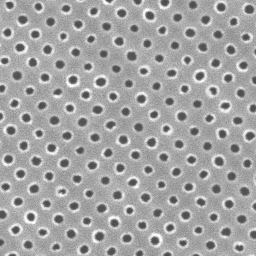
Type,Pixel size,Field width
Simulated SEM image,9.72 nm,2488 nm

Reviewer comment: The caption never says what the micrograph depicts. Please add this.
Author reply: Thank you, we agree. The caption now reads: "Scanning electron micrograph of a regular array of holes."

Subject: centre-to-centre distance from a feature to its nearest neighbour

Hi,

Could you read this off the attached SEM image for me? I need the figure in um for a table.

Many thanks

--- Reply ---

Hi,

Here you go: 0.188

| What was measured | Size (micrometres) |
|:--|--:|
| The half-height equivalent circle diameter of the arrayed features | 0.0843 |